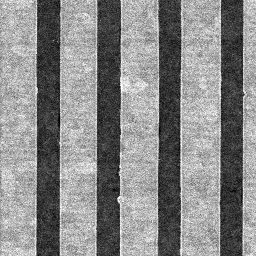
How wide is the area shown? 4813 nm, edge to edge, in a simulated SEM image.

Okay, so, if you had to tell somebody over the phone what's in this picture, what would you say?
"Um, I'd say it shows one or a few lines or trenches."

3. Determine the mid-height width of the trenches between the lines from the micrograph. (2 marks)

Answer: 442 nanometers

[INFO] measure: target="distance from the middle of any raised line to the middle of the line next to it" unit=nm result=1150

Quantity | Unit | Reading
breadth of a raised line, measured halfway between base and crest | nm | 703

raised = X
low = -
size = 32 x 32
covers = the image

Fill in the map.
XXXXX---XXXX---XXXXX---XXXX---XX
XXXXX---XXXX---XXXXX---XXXX---XX
XXXXX---XXXX---XXXXX---XXXX---XX
XXXXX---XXXX---XXXXX---XXXXX--XX
XXXXX---XXXX---XXXXX---XXXXX--XX
XXXX----XXXX---XXXXX---XXXXX--XX
XXXX----XXXX---XXXXX---XXXXX--XX
XXXX----XXXX---XXXXX---XXXXX--XX
XXXX----XXXX---XXXXX---XXXXX--XX
XXXX----XXXX---XXXXX---XXXXX--XX
XXXX----XXXX---XXXXX---XXXXX--XX
XXXXX---XXXX---XXXXX---XXXXX--XX
XXXXX---XXXX---XXXXX---XXXXX--XX
XXXXX---XXXX---XXXXX---XXXX---XX
XXXXX-XXXXXX---XXXXX---XXXX---XX
XXXXX-XXXXXX---XXXXX---XXXX---XX
XXXXX---XXXX---XXXXXX--XXXX---XX
XXXXX---XXXX---XXXXX---XXXX---XX
XXXXX---XXXX---XXXXX---XXXX---XX
XXXXX---XXXX---XXXXX---XXXX---XX
XXXXX---XXXX---XXXXX---XXXX---XX
XXXXX---XXXX---XXXXX---XXXX---XX
XXXXX---XXXX---XXXXX---XXXX---XX
XXXXX---XXXX---XXXXX---XXXX---XX
XXXXX---XXXX---XXXXX---XXXX---XX
XXXX----XXXX---XXXXX---XXXX---XX
XXXX----XXXX---XXXXX---XXXX---XX
XXXX----XXXX---XXXXX---XXXX---XX
XXXX----XXXX---XXXXX---XXXX---XX
XXXX----XXXX---XXXXX---XXXX---XX
XXXX----XXXX---XXXXX---XXXX---XX
XXXX----XXXX---XXXXX---XXXX---XX